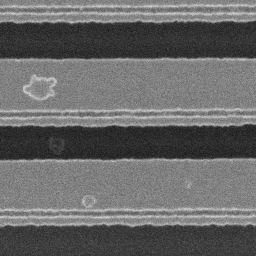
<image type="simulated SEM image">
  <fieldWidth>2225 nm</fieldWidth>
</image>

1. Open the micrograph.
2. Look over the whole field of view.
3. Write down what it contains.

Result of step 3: lines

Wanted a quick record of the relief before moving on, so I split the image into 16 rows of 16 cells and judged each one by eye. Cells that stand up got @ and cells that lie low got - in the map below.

@@@@@@@@@@@@@@@@
----------------
----------------
----------------
@@@@@@@@@@@@@@@@
@@@@@@@@@@@@@@@@
@@@@@@@@@@@@@@@@
@@@@@@@@@@@@@@@@
----------------
----------------
@@@@@@@@@@@@@@@@
@@@@@@@@@@@@@@@@
@@@@@@@@@@@@@@@@
@@@@@@@@@@@@@@@@
----------------
----------------